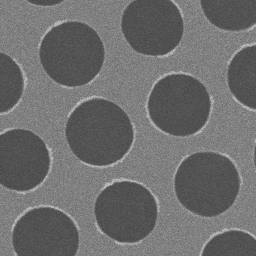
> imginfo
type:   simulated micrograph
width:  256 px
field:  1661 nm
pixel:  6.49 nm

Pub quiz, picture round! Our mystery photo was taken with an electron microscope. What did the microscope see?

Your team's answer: holes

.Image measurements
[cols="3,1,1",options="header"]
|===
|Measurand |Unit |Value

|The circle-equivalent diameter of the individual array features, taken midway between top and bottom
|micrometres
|0.421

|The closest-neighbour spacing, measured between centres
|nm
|542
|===